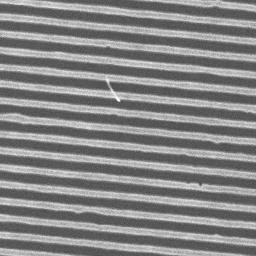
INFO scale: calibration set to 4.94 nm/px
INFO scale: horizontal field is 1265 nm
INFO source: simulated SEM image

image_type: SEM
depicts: parallel lines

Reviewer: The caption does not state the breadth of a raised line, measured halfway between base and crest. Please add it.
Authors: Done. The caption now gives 38.7 nm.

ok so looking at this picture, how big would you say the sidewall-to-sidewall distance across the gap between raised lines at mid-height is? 43 nanometres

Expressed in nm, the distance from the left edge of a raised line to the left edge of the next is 82.5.